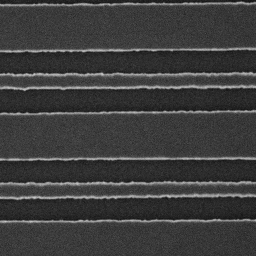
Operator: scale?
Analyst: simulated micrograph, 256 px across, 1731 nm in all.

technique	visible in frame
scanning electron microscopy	lines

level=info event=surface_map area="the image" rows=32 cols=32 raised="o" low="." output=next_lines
...............oooooo..ooooooooo
oooooooooooooooooooooooooooooooo
oooooooooooooooooooooooooooooooo
oooooooooooooooooooooooooooooooo
oooooooooooooooooooooooooooooooo
oooooooooooooooooooooooooooooooo
................................
................................
................................
oooooooooooooooooooooooooooooooo
oooooooooooooooooooooooooooooooo
................................
................................
................................
oooooooooooooooooooooooooooooooo
oooooooooooooooooooooooooooooooo
oooooooooooooooooooooooooooooooo
oooooooooooooooooooooooooooooooo
oooooooooooooooooooooooooooooooo
oooooooooooooooooooooooooooooooo
................................
................................
................................
oooooooooooooooooooooooooooooooo
ooooooooooooooooooooooo.........
................................
................................
...................o......oo.ooo
oooooooooooooooooooooooooooooooo
oooooooooooooooooooooooooooooooo
oooooooooooooooooooooooooooooooo
oooooooooooooooooooooooooooooooo